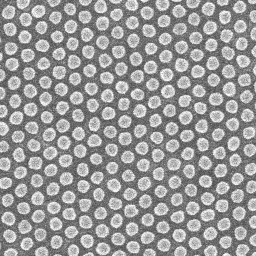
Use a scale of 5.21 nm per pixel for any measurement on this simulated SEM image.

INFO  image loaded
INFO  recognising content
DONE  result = a regular array of raised bodies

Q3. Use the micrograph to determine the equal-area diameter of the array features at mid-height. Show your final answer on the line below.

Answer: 0.062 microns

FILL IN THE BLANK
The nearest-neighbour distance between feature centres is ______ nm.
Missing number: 88.4